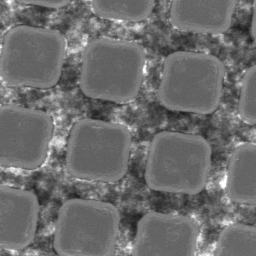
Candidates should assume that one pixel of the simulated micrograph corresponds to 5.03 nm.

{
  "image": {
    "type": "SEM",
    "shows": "raised bodies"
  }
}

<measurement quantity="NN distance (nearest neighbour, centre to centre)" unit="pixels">80.7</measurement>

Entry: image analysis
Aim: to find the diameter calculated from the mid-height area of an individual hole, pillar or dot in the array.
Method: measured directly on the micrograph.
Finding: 306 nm